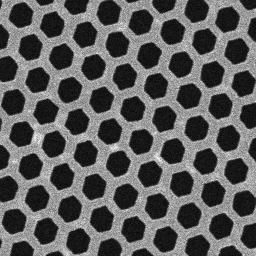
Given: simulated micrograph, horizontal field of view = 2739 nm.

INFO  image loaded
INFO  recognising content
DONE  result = a regular array of holes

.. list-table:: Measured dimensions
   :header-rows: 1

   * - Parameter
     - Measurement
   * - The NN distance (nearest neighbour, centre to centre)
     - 347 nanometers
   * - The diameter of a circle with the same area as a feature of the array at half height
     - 267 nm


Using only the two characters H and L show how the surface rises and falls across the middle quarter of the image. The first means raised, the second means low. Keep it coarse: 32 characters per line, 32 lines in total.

LLHHLLLLLLHHHLLLLHHHLLLHHHLLLLLL
HHHHLLLLLLHHHLLLLLHHHHHHHHLLLLLL
HHHHHLLLLLHHLLLLLLHHHHLLLHHLLLLH
HLLHHHLLLHHHLLLLLLHHHLLLLHHHLHHH
LLLLHHHHHHHHLLLLLLHHLLLLLLHHHHHH
LLLLLHHHHHHHHLLLLLHHLLLLLLHHHLLL
LLLLHHHLLLLHHHLHHHHHLLLLLLHHHLLL
LLLLHHHLLLLLHHHHHHHHHLLLLHHHLLLL
LLLLHHHLLLLLLHHHLLLHHHLLHHHHLLLL
LLHHHHLLLLLLHHHLLLLLHHHHHHHHLLLL
HHHHHHHLLLLLHHLLLLLLHHHHHLHHHLLL
HHHLLHHLLLLHHHLLLLLLHHHLLLLHHHHH
HLLLLHHHHHHHHHLLLLLLHHLLLLLLHHHH
HLLLLLHHHHHHHHHLLLLLHHLLLLLLHHHL
LLLLLLHHHLLLLHHHLHHHHHLLLLLLHHHL
LLLLLLHHHLLLLLHHHHHHHHHLLLLLHHLL
HLLLLLHHHLLLLLLHHHHLLHHLLLHHHHLL
HHLLHHHHLLLLLLHHHLLLLLHHHHHHHHLL
HHHHHHHHHLLLLLHHHLLLLLHHHHHHHHHL
HHHHHLLHHHLLLHHHLLLLLLHHHLLLLHHH
HHHLLLLLHHHHHHHHLLLLLLHHHLLLLLHH
HHHLLLLLLHHHHHHHHLLLLLHHLLLLLLHH
HHHLLLLLHHHHLLLLHHLHHHHHLLLLLLHH
HHLLLLLLHHHLLLLLHHHHHHHHHLLLLLHH
HHHLLLLLHHHLLLLLLHHHHLLHHHLLLHHH
LHHHLLHHHHLLLLLLHHHLLLLLHHHHHHHH
LLHHHHHHHHHLLLLLHHHLLLLLLHHHHHHH
LLLHHHHLLHHHLLLHHHLLLLLLHHHLLLLH
LLHHHLLLLLHHHHHHHHHLLLLLHHHLLLLL
LLHHHLLLLLLHHHHHHHHLLLLLHHHLLLLL
LLHHHLLLLLLHHHLLLHHHLLHHHHLLLLLL
HHHHLLLLLLHHHLLLLLHHHHHHHHHLLLLL